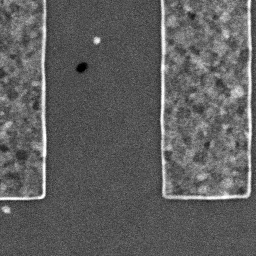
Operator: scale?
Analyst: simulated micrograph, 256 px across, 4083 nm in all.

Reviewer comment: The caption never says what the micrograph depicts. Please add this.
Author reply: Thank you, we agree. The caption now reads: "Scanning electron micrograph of wiring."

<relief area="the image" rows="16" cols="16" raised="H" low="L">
HHHLLLLLLLHHHHHH
HHHLLLLLLLHHHHHH
HHHLLLLLLLHHHHHH
HHHLLLLLLLHHHHHH
HHHLLLLLLLHHHHHH
HHHLLLLLLLHHHHHH
HHHLLLLLLLHHHHHH
HHHLLLLLLLHHHHHH
HHHLLLLLLLHHHHHH
HHHLLLLLLLHHHHHH
HHHLLLLLLLHHHHHH
HHHLLLLLLLHHHHHH
LLLLLLLLLLLLLLLL
LLLLLLLLLLLLLLLL
LLLLLLLLLLLLLLLL
LLLLLLLLLLLLLLLL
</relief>